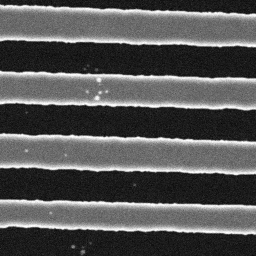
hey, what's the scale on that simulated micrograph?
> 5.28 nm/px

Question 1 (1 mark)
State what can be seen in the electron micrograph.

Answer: lines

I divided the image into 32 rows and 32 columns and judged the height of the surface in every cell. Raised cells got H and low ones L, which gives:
LLLLLLLLLLLLLLLLLLLLLLLLLLLLLLLL
HHHHHHHHHHHHHHHHHHHHHHHHLLLLLLLL
HHHHHHHHHHHHHHHHHHHHHHHHHHHHHHHH
HHHHHHHHHHHHHHHHHHHHHHHHHHHHHHHH
HHHHHHHHHHHHHHHHHHHHHHHHHHHHHHHH
LLLLLLLLLLLLLLLLLHLHLLLHHHHHHHHH
LLLLLLLLLLLLLLLLLLLLLLLLLLLLLLLL
LLLLLLLLLLLLLLLLLLLLLLLLLLLLLLLL
LLLLLLLLLLLLLLLLLLLLLLLLLLLLLLLL
HHHHHHHHHHHHHHHHHHHLLHLLLLLLLLLL
HHHHHHHHHHHHHHHHHHHHHHHHHHHHHHHH
HHHHHHHHHHHHHHHHHHHHHHHHHHHHHHHH
HHHHHHHHHHHHHHHHHHHHHHHHHHHHHHHH
LLLLLLLLLLLLLLLLLLLLLLLLLLHHLHHH
LLLLLLLLLLLLLLLLLLLLLLLLLLLLLLLL
LLLLLLLLLLLLLLLLLLLLLLLLLLLLLLLL
LLLLLLLLLLLLLLLLLLLLLLLLLLLLLLLL
HHHHHHHHHHHHHHHHHHHHHHHHLLLLLLLL
HHHHHHHHHHHHHHHHHHHHHHHHHHHHHHHH
HHHHHHHHHHHHHHHHHHHHHHHHHHHHHHHH
HHHHHHHHHHHHHHHHHHHHHHHHHHHHHHHH
LLLLLLLLLLLLLLLLLLLLLLLHHHHHHHHH
LLLLLLLLLLLLLLLLLLLLLLLLLLLLLLLL
LLLLLLLLLLLLLLLLLLLLLLLLLLLLLLLL
LLLLLLLLLLLLLLLLLLLLLLLLLLLLLLLL
HHHHHHHHHHHHHHHHHHHHHHLLLLLLLLLL
HHHHHHHHHHHHHHHHHHHHHHHHHHHHHHHH
HHHHHHHHHHHHHHHHHHHHHHHHHHHHHHHH
LLLLLLHHHHHHHHHHHHHHHHHHHHHHHHHH
LLLLLLLLLLLLLLLLLLLLLLLLLLLLLLLL
LLLLLLLLLLLLLLLLLLLLLLLLLLLLLLLL
LLLLLLLLLLLLLLLLLLLLLLLLLLLLLLLL